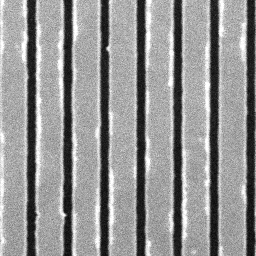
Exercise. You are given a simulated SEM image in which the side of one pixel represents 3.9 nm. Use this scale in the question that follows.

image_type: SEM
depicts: parallel lines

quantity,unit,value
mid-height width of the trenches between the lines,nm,37.5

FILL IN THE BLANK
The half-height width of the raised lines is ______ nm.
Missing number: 104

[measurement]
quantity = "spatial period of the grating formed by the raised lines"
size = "142 nm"